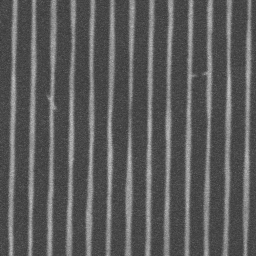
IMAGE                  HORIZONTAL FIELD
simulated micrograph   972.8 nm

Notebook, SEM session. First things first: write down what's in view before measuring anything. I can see parallel lines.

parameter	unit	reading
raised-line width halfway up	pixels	3.87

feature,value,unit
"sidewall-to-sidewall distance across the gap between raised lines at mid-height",59.9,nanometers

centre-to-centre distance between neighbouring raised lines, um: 0.0743